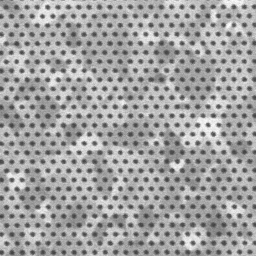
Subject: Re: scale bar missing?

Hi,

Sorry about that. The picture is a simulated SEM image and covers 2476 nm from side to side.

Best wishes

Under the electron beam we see a regular array of holes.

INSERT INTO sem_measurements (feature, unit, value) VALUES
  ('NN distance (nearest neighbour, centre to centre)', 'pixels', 10.2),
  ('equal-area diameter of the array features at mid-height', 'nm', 57.7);